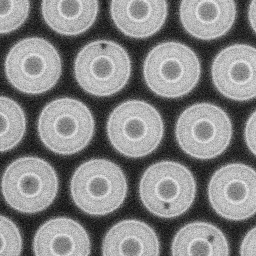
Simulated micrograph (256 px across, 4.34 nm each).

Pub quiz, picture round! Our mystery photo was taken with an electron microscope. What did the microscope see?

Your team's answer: an array of small figures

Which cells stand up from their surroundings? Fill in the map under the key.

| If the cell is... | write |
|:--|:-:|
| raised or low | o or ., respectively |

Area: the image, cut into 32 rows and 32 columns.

...ooo......oo.......oo......ooo
...ooo......oo.......oo......oo.
...ooo......oo......ooo......oo.
..ooooo....oooo.....ooo.....oooo
ooooooooooooooooooooooooo..ooooo
oo....oooooo..ooooooo.oooooooooo
o......ooo.....oooo.....oooo....
o......ooo......oo......ooo.....
o......ooo......oo.......oo.....
o......ooo......oo.......oo.....
oo.....ooo.....oooo.....ooo.....
oooooooooooo..oooooo...ooooo....
.ooooooooooooooooooooooooooooooo
..oooo.....oooo....ooooo...ooooo
...oo......ooo......ooo.....oooo
...oo......ooo......oo.......oo.
...oo......ooo......oo.......oo.
..oooo.....ooo......oo......ooo.
.ooooo....ooooo....oooo.....ooo.
ooooooooooooooooooooooooo.oooooo
oo....ooooo...oooooo..oooooooooo
o......ooo.....ooo.....oooo.....
o......oo......ooo......ooo.....
.......oo.......oo......oo......
o......oo......ooo......oo......
o.....oooo.....ooo......ooo.....
ooooooooooo..oooooo....oooo.....
.oooooo.oooooooooooooooooooooooo
..ooo.....oooo....ooooo....ooooo
..ooo......oo......ooo......ooo.
..oo.......oo.......oo......oo..
..ooo......oo.......oo......oo..